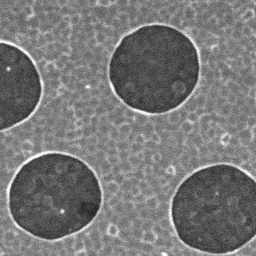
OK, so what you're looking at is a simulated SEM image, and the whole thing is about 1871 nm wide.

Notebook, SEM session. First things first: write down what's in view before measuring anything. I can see holes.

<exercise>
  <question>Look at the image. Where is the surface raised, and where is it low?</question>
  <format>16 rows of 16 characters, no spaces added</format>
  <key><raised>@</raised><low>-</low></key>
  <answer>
@@@@@@@@@@@@@@@@
@@@@@@@@@@@@@@@@
@@@@@@@@----@@@@
--@@@@@-----@@@@
--@@@@@-----@@@@
---@@@@-----@@@@
--@@@@@@---@@@@@
--@@@@@@@@@@@@@@
@@@@@@@@@@@@@@@@
@@@@@@@@@@@@@@@@
@-----@@@@@@@--@
@-----@@@@@-----
@-----@@@@@-----
@-----@@@@@-----
@@---@@@@@@-----
@@@@@@@@@@@@---@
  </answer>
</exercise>